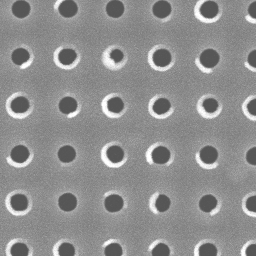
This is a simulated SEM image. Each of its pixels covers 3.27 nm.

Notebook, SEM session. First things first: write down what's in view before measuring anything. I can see a regular array of holes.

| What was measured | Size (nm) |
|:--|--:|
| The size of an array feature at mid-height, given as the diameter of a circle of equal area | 57.8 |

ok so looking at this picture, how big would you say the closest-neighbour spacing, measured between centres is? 0.152 um